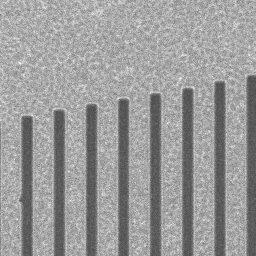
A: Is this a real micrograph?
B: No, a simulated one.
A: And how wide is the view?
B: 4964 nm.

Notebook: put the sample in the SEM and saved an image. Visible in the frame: parallel lines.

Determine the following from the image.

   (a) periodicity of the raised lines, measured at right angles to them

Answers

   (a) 624 nm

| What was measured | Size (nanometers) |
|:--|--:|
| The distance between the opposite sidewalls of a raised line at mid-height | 419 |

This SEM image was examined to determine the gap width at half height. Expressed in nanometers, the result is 201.